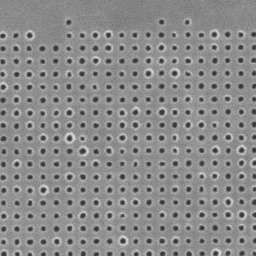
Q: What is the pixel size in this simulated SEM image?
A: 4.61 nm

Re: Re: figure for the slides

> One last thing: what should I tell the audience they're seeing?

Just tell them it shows a regular array of holes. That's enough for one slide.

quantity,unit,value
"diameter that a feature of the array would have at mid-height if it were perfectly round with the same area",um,0.0233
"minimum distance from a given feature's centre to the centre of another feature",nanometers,58.4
